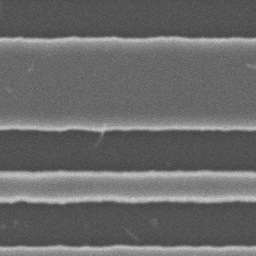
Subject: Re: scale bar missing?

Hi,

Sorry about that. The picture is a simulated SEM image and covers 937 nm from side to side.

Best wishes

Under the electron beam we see lines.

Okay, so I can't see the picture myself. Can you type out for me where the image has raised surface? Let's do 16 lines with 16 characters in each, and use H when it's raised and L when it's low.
LLLLLLLLLLLLLLLL
LLLLLLLLLLLLLLLL
HHHHHHHHHHHHHHHH
HHHHHHHHHHHHHHHH
HHHHHHHHHHHHHHHH
HHHHHHHHHHHHHHHH
HHHHHHHHHHHHHHHH
HHHHHHHHHHHHHHHH
LLLLLLLLLLLLLLLL
LLLLLLLLLLLLLLLL
LLLLLLLLLLLLLLLL
HHHHHHHHHHHHHHHH
HHHHHHHHHHHHHHHH
LLLLLLLLLLLLLLLL
LLLLLLLLLLLLLLLL
HHHHHHHHHHHHHHHH